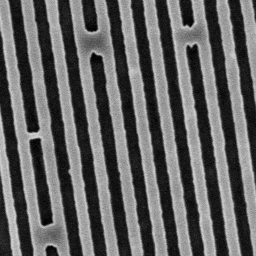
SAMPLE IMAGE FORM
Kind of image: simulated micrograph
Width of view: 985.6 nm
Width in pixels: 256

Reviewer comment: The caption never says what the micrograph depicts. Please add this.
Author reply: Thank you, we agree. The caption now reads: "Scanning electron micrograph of parallel lines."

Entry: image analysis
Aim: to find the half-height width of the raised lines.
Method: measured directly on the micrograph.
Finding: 42.9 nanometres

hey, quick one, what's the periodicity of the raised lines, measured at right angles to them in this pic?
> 92.8 nanometres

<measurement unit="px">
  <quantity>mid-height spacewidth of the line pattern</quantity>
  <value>13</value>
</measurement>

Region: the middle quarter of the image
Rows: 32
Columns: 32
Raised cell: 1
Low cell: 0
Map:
00001110001110001110001110001110
10001110001110001110001110000110
10001110001110001110000110000110
10001110000110001110000110000110
10001110000110000111000111000110
10000110000110000111000111000111
10000110000110000111000111000111
11000111000111000111000111000111
11000111000111000111000111000011
11000111000111000111000111000011
11000011000111000111000011000011
11000011000011000011000011100011
11000011000011100011000011100011
11000011000011100011100011100011
11000011100011100011100011100011
11100011100011100011100011100011
11100011100011100011100011100001
11100011100001100001100001100001
11100001100001100001110001100001
01100001100001100001110001110001
01110001110001110001110001110001
01110001110001110001110001110000
01110001110001110001110000110000
01110001110001110001110000110000
01110000110001110000110000110000
00110000110000110000111000110000
01110000110000110000111000111000
00110000111000111000111000111000
00111000111000111000111000111000
00111000111000111000111000011000
00111000111000111000011000011000
00011000011000111000011000011100